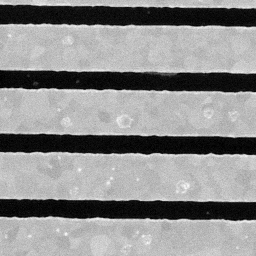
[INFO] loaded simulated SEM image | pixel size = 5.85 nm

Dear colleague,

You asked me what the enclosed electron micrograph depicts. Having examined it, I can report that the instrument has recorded lines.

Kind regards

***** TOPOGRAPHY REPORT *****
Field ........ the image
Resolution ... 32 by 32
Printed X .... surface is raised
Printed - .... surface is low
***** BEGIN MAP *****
XXXXXXXXXXXXXXXXXXXXXXXXXXXXXXXX
--------------------------------
--------------------------------
XXXXXXXXXXXXXXXXXXXXXXXXXXXXXXXX
XXXXXXXXXXXXXXXXXXXXXXXXXXXXXXXX
XXXXXXXXXXXXXXXXXXXXXXXXXXXXXXXX
XXXXXXXXXXXXXXXXXXXXXXXXXXXXXXXX
XXXXXXXXXXXXXXXXXXXXXXXXXXXXXXXX
XXXXXXXXXXXXXXXXXXXXXXXXXXXXXXXX
--------------------------------
--------------------------------
XXXXXXXXXXXXXXXXXXXXXXXXXXXX--XX
XXXXXXXXXXXXXXXXXXXXXXXXXXXXXXXX
XXXXXXXXXXXXXXXXXXXXXXXXXXXXXXXX
XXXXXXXXXXXXXXXXXXXXXXXXXXXXXXXX
XXXXXXXXXXXXXXXXXXXXXXXXXXXXXXXX
XXXXXXXXXXXXXXXXXXXXXXXXXXXXXXXX
--------------------------------
--------------------------------
XXXXXXXXXXXXXXXXXXXXXXXXXXXXXXXX
XXXXXXXXXXXXXXXXXXXXXXXXXXXXXXXX
XXXXXXXXXXXXXXXXXXXXXXXXXXXXXXXX
XXXXXXXXXXXXXXXXXXXXXXXXXXXXXXXX
XXXXXXXXXXXXXXXXXXXXXXXXXXXXXXXX
XXXXXXXXXXXXXXXXXXXXXXXXXXXXXXXX
--------------------------------
--------------------------------
XXXXXXXXXXXXXXXXXXXXX-XX--XX----
XXXXXXXXXXXXXXXXXXXXXXXXXXXXXXXX
XXXXXXXXXXXXXXXXXXXXXXXXXXXXXXXX
XXXXXXXXXXXXXXXXXXXXXXXXXXXXXXXX
XXXXXXXXXXXXXXXXXXXXXXXXXXXXXXXX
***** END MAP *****